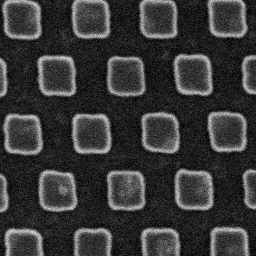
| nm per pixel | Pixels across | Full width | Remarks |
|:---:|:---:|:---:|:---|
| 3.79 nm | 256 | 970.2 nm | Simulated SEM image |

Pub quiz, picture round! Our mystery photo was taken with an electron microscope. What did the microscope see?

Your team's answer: a regular array of raised bodies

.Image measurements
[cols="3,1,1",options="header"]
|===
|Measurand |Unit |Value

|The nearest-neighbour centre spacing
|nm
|252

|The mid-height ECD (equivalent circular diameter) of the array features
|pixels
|40.1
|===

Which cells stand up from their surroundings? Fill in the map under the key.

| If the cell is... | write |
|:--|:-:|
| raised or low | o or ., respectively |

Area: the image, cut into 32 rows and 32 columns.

.ooo.....oooo.....oooo....oooo..
.oooo....oooo.....oooo....ooooo.
.oooo....ooooo....oooo....ooooo.
.oooo....ooooo....oooo....ooooo.
.oooo.....ooo.....oooo......oo..
................................
................................
.....oooo.....ooo.....oooo.....o
o....oooo.....oooo....oooo....oo
o....oooo.....oooo....oooo....oo
o....oooo.....oooo....oooo....oo
o....oooo.....oooo.....ooo.....o
................................
................................
.oo.......ooo.....ooo.....oooo..
.oooo....ooooo....oooo....ooooo.
.oooo....ooooo....oooo....ooooo.
.oooo....ooooo....oooo....ooooo.
.oooo.....oooo....oooo.....ooo..
................................
................................
......o.......oo.......oo......o
o....oooo....ooooo....oooo....oo
o....oooo.....oooo....oooo.....o
o....oooo.....oooo....oooo.....o
o....oooo.....oooo....oooo.....o
................................
................................
................................
.oooo....ooooo....oooo.....oooo.
.oooo....ooooo....oooo....ooooo.
.oooo....ooooo....oooo....ooooo.